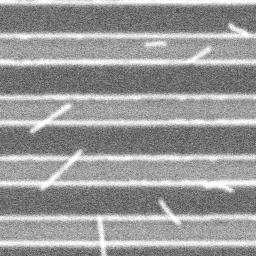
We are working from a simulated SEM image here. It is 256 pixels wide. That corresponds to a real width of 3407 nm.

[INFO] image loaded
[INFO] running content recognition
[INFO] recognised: lines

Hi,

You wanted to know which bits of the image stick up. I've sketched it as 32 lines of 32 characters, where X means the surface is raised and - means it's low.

XXXXXXXXXXXXXXXXXXXXXXXXXXXXXXXX
XXXXXXXXXXXXXXXXXXXXXXXXXXXXXXXX
XXXXXXXXXXXXXXXXXXXXXXXXXXXXXXXX
XXXXXXXXXXXXXXXXXXXXXXXXXXXXXXXX
XXXXXXXXXXXXXXXXXXXXXXXXXXXXXXXX
--------------------------------
--------------------------------
--------------------------------
XXXXXXXXXXXXXXXXXXXXXXXXXXXXXXXX
XXXXXXXXXXXXXXXXXXXXXXXXXXXXXXXX
XXXXXXXXXXXXXXXXXXXXXXXXXXXXXXXX
XXXXXXXXXXXXXXXXXXXXXXXXXXXXXXXX
--------------------------------
--------------------------------
--------------------------------
XXXXXXXXXXXXXXXXXXXXXXXXXXXXXXXX
XXXXXXXXXXXXXXXXXXXXXXXXXXXXXXXX
XXXXXXXXXXXXXXXXXXXXXXXXXXXXXXXX
XXXXXXXXXXXXXXXXXXXXXXXXXXXXXXXX
XXXXXXXXXXXXXXXXXXXXXXXXXXXXXXXX
--------------------------------
--------------------------------
--------------------------------
XXXXXXXXXXXXXXXXXXXXXXXXXXXXXXXX
XXXXXXXXXXXXXXXXXXXXXXXXXXXXXXXX
XXXXXXXXXXXXXXXXXXXXXXXXXXXXXXXX
XXXXXXXXXXXXXXXXXXXXXXXXXXXXXXXX
----------------------X---------
--------------------------------
--------------------------------
XXXXXXXXXXXXXXXXXXXXXXXXXXXXXXXX
XXXXXXXXXXXXXXXXXXXXXXXXXXXXXXXX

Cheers